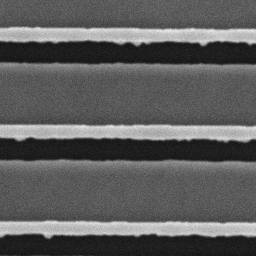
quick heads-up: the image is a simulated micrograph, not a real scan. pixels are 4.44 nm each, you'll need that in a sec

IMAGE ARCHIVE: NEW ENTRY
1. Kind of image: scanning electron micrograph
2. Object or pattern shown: lines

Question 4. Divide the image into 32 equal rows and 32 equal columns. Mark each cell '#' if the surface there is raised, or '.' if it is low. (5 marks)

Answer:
################################
################################
################################
################################
################################
.................#.......#.....#
................................
................................
################################
################################
################################
################################
################################
################################
################################
################################
################################
..#........................####.
................................
................................
################################
################################
################################
################################
################################
################################
################################
################################
################################
#.....#...................#.#..#
................................
................................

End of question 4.